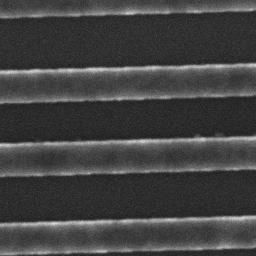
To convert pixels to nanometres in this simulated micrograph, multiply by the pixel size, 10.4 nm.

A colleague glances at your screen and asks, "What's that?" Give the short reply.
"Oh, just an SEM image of lines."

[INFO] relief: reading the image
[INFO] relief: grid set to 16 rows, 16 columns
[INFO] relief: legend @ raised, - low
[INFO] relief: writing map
@@@@@@@@@@@@@@@@
----------------
----------------
----------------
@@@@@@@@@@@@@@@@
@@@@@@@@@@@@@@@@
----------------
----------------
----------------
@@@@@@@@@@@@@@@@
@@@@@@@@@@@@@@@@
----------------
----------------
----------------
@@@@@@@@@@@@@@@@
@@@@@@@@@@@@@@--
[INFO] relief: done